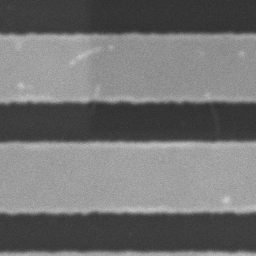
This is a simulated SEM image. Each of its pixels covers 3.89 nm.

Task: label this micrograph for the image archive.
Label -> lines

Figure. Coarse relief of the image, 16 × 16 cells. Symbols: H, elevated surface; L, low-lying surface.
LLLLLLLLLLLLLLLL
LLLLLLLLLLLLLLLL
HHHHHHHHHHHHHHHH
HHHHHHHHHHHHHHHH
HHHHHHHHHHHHHHHH
HHHHHHHHHHHHHHHH
LLLLLLLLLLLLLLLL
LLLLLLLLLLLLLLLL
LLLLLLLLLLLLLLLL
HHHHHHHHHHHHHHHH
HHHHHHHHHHHHHHHH
HHHHHHHHHHHHHHHH
HHHHHHHHHHHHHHHH
LLLLLLLLLLLLLLLL
LLLLLLLLLLLLLLLL
LLLLLLLLLLLLLLLL